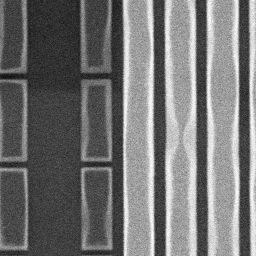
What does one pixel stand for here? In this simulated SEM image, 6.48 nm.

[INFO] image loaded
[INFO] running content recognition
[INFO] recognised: wiring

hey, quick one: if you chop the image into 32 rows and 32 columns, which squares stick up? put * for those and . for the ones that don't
***.......****..***..***..****..
***.......****..***..***..****..
***.......****..***..***..****..
***.......****..***..***..****..
***.......***...***..***..***...
***.......***...***..***..***...
***........**...***..***..***...
***........**...***..***..****..
***........**...***..***..****..
................***..***..****.*
***........**...***..***..****.*
***........***..***..***..****.*
***........***..***..***..****.*
***........***..***..***..****..
***........***..***..***..****..
***........***..***..***..****..
***........***..***...**..***...
***........***..***..***..***...
***........***..***..***..***...
***........***..***..***..***...
................***..***..***...
***.......****..***..***..****..
***.......****..***..***..****..
***.......****..***..***..****..
***.......****..***..***..****..
***........***..***..***..****..
***........***..***..***..****..
***........***..***..***..***...
***........***..***..***...**...
***........***..***..***...**...
***........***..***..***...**...
................***..***...**...